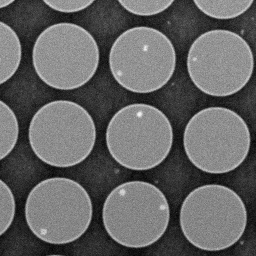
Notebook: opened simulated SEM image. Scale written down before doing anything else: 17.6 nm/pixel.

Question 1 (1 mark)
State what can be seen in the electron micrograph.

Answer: an array of small figures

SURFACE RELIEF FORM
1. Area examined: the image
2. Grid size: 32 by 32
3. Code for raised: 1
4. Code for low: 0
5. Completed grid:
10000011111000011111100011111110
00000000000000000111000001111100
00000000000000000000000000000000
10000011110000000110000000000000
11000111111000011111100001111100
11001111111100111111100011111110
11101111111100111111110011111110
11001111111100111111110111111111
11001111111100111111110011111111
10000111111000111111100011111110
00000011110000011111100011111110
00000000000000000110000000111000
00000000000000000000000000000000
10000111110000001110000000000000
11001111111000111111100011111100
11001111111100111111100111111110
11001111111101111111110111111110
11001111111101111111110111111110
11001111111000111111100111111110
10000111111000111111100011111110
00000011110000011111000011111100
00000000000000000000000000110000
00000011100000000000000000000000
10001111110000011110000001110000
11001111111000111111000011111100
11011111111001111111100111111100
11011111111001111111100111111110
10011111111001111111100111111110
10001111111001111111100111111110
00000111110000111111000111111100
00000000000000011110000011111000
00000000000000000000000000000000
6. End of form